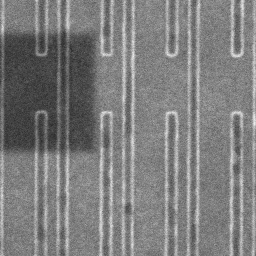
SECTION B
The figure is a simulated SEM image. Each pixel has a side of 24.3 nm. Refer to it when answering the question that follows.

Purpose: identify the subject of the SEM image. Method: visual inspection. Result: wiring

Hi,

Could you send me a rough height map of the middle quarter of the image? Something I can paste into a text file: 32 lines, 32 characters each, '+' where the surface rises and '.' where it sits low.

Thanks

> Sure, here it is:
+..............++..............+
+..............++..............+
+..............++..............+
+..............++..............+
+..............++..............+
+..............++..............+
+..............++..............+
+..............++..............+
+..............++..............+
+..............++..............+
+..............++..............+
+..............++..............+
+.........++...++.........++...+
+.........++...++.........++...+
+.........++...++.........++...+
+........+++...++.........++...+
+........+++...++.........++...+
+........+++...++.........++...+
+........+++...++.........++...+
+........+++...++.........++...+
+........+++...++.........++...+
+.........++...++.........++...+
+........+++...++.........++...+
+........+++...++.........++...+
+........+++...++.........++...+
+........+++...++.........++...+
+........+++...++.........++...+
+........+++...++.........++...+
+........+++...++.........++...+
+........+++...++.........++...+
+........+++...++.........++...+
+........+++...++.........++...+